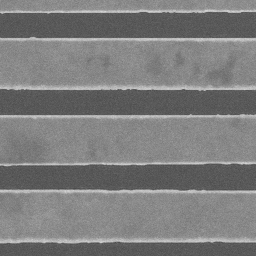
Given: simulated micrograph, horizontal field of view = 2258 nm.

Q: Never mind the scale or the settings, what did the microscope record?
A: lines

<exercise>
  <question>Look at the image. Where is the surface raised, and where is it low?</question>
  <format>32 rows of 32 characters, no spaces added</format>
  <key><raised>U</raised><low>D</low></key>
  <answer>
UUUUUUUUUUUUUUUUUUUUUUUUUUUUUUUU
UUUUUUUUUUUUUUUUUUUUDDUDUDDDUUUD
DDDDDDDDDDDDDDDDDDDDDDDDDDDDDDDD
DDDDDDDDDDDDDDDDDDDDDDDDDDDDDDDD
DDDDDDDDDDDDDDDDDDDDDDDDDDDDDDDD
UUUUUUUUUUUUUUUUUUUUUUUUUUUUUUUU
UUUUUUUUUUUUUUUUUUUUUUUUUUUUUUUU
UUUUUUUUUUUUUUUUUUUUUUUUUUUUUUUU
UUUUUUUUUUUUUUUUUUUUUUUUUUUUUUUU
UUUUUUUUUUUUUUUUUUUUUUUUUUUUUUUU
UUUUUUUUUUUUUUUUUUUUUUUUUUUUUUUU
DDDDDDDDDDDDDDDDDDDDDDDDDDDDDDDD
DDDDDDDDDDDDDDDDDDDDDDDDDDDDDDDD
DDDDDDDDDDDDDDDDDDDDDDDDDDDDDDDD
UUUUUUUUUUUUUUUUUUUUUUUUUUUUUUUU
UUUUUUUUUUUUUUUUUUUUUUUUUUUUUUUU
UUUUUUUUUUUUUUUUUUUUUUUUUUUUUUUU
UUUUUUUUUUUUUUUUUUUUUUUUUUUUUUUU
UUUUUUUUUUUUUUUUUUUUUUUUUUUUUUUU
UUUUUUUUUUUUUUUUUUUUUUUUUUUUUUUU
UUUUUUUUUUUDDDUUDUDDDDDDDDDDDDDD
DDDDDDDDDDDDDDDDDDDDDDDDDDDDDDDD
DDDDDDDDDDDDDDDDDDDDDDDDDDDDDDDD
DDDDDDDDDDDDDDDDDDDDDDDDDDDDDDDD
UUUUUUUUUUUUUUUUUUUUUUUUUUUUUUUU
UUUUUUUUUUUUUUUUUUUUUUUUUUUUUUUU
UUUUUUUUUUUUUUUUUUUUUUUUUUUUUUUU
UUUUUUUUUUUUUUUUUUUUUUUUUUUUUUUU
UUUUUUUUUUUUUUUUUUUUUUUUUUUUUUUU
UUUUUUUUUUUUUUUUUUUUUUUUUUUUUUUU
DDDDDDDDDDDDDDDDDDDDDDDDDDDDDDDD
DDDDDDDDDDDDDDDDDDDDDDDDDDDDDDDD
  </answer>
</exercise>